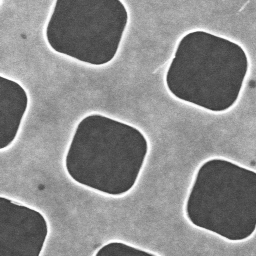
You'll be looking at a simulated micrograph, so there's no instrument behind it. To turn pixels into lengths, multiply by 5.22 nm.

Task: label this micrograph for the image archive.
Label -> holes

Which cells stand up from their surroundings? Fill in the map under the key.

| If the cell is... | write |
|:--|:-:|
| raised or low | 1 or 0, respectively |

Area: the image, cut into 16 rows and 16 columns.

1110000011111111
1110000011111111
1110000011100011
1111000111100001
1111111111000001
0111111111100001
0011111111110001
0111100111111111
0111100001111111
1111000001111111
1111000001111001
1111100011110000
1111111111110000
0001111111110000
0001111111111000
0001110011111111